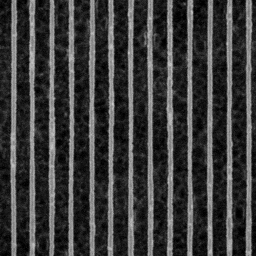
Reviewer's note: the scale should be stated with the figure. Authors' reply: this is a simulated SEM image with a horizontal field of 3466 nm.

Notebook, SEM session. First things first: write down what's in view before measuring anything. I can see parallel lines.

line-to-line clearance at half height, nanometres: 218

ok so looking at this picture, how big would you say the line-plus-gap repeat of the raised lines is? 0.266 microns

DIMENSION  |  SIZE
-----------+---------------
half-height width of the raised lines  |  0.0542 micrometres